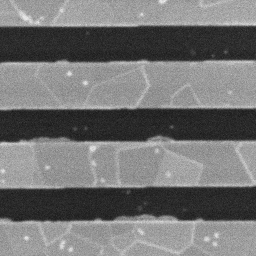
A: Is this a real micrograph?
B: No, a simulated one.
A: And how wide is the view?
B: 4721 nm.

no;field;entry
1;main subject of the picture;lines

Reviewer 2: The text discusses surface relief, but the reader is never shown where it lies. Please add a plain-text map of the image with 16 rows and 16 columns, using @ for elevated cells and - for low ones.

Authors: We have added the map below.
@@@@@@@@@@@@@@@@
@@@@@@@@@@@@@@@@
----------------
----------------
@@@@@@@@@@@@@@@@
@@@@@@@@@@@@@@@@
@@@@@@@@@@@@@@@@
----------------
----------------
@@@@@@@@@@@@@@@@
@@@@@@@@@@@@@@@@
@@@@@@@@@@@@@@@@
----------------
----------------
@@@@@@@@@@@@@@@@
@@@@@@@@@@@@@@@@